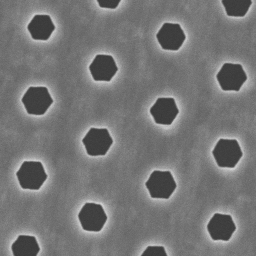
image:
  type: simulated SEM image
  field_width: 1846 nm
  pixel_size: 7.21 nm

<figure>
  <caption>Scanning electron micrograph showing a regular array of holes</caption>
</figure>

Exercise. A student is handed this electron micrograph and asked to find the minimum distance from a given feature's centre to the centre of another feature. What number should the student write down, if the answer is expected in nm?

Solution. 531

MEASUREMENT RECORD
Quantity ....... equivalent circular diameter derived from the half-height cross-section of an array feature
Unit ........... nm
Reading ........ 205